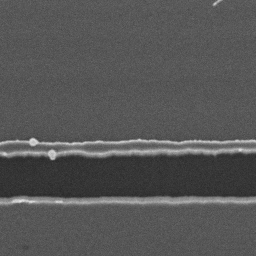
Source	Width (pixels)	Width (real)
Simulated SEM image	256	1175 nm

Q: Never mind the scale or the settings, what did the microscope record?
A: lines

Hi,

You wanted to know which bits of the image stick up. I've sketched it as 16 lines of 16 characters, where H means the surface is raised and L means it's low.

HHHHHHHHHHHHHHHH
HHHHHHHHHHHHHHHH
HHHHHHHHHHHHHHHH
HHHHHHHHHHHHHHHH
HHHHHHHHHHHHHHHH
HHHHHHHHHHHHHHHH
HHHHHHHHHHHHHHHH
HHHHHHHHHHHHHHHH
HHHHHHHHHHHHHHHH
HHHHHHHHHLLLLLLL
LLLLLLLLLLLLLLLL
LLLLLLLLLLLLLLLL
LHLLLLLLLLLLLHLL
HHHHHHHHHHHHHHHH
HHHHHHHHHHHHHHHH
HHHHHHHHHHHHHHHH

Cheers